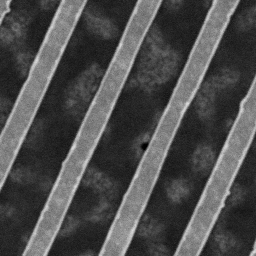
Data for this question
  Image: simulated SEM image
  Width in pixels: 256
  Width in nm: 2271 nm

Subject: one or a few lines or trenches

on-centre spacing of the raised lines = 0.615 µm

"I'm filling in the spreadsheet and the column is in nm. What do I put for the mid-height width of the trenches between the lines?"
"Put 440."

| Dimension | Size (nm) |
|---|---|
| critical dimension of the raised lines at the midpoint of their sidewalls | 181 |